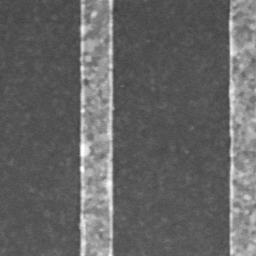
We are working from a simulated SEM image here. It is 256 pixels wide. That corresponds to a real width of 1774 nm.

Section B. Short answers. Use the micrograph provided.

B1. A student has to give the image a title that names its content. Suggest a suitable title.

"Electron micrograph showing one or a few lines or trenches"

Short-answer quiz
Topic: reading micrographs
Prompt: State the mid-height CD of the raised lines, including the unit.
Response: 28.4 px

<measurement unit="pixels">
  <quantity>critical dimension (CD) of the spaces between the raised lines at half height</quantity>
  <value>120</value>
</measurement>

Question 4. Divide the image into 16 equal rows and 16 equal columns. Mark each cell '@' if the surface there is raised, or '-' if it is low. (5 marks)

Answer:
-----@@-------@@
-----@@-------@@
-----@@-------@@
-----@@-------@@
-----@@-------@@
-----@@-------@@
-----@@-------@@
-----@@-------@@
-----@@-------@@
-----@@-------@@
-----@@-------@@
-----@@-------@@
-----@@-------@@
-----@@-------@@
-----@@-------@@
-----@@-------@@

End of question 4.